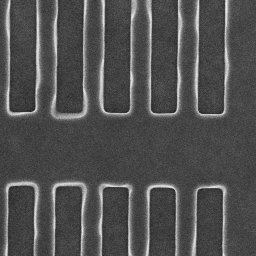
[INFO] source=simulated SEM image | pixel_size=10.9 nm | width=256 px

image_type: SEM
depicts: groups of lines, slits or small figures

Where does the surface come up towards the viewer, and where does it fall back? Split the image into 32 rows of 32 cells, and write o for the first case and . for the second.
o....oo....oo....oo...ooo...oooo
o....oo....oo....oo...ooo...oooo
o....oo....oo...ooo....oo...oooo
o....oo....oo...ooo...ooo...oooo
o....oo....oo...ooo...ooo...oooo
o....oo...ooo...ooo...ooo...oooo
o....oo...ooo...ooo...ooo...oooo
o....oo....oo...ooo...ooo...oooo
o....oo....oo...ooo...ooo...oooo
o....oo...ooo...ooo...ooo...oooo
o....oo...ooo...ooo...ooo...oooo
o....oo....oo...ooo...ooo...oooo
o....oo....oo...ooo...ooo...oooo
o...ooo....oo...ooo...ooo...oooo
oooooooo.ooooooooooooooooooooooo
oooooooooooooooooooooooooooooooo
oooooooooooooooooooooooooooooooo
oooooooooooooooooooooooooooooooo
oooooooooooooooooooooooooooooooo
oooooooooooooooooooooooooooooooo
oooooooooooooooooooooooooooooooo
oooooooooooooooooooooooooooooooo
oooooooooooooooooooooooooooooooo
o...ooo...ooo...ooo..oooo...oooo
o....oo....oo...ooo...ooo...oooo
o...ooo...ooo...ooo...oo....oooo
o...ooo...ooo...ooo...oo....oooo
o...ooo...ooo...ooo...oo....oooo
o...ooo...ooo...ooo...oo....oooo
o...ooo...ooo...ooo...oo....oooo
o...ooo...ooo...ooo...oo....oooo
o...ooo...ooo...oo....oo....oooo